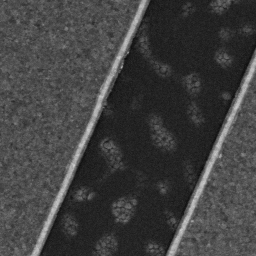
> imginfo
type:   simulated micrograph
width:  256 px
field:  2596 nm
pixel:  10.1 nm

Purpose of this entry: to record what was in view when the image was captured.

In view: one or a few lines or trenches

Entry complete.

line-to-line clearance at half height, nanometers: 1280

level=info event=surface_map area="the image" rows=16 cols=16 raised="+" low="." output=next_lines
+++++++++.......
++++++++........
++++++++........
+++++++.........
+++++++.........
+++++++........+
++++++.........+
++++++........++
+++++.........++
+++++.........++
++++.........+++
++++.........+++
++++........++++
+++.........++++
+++........+++++
++.........+++++